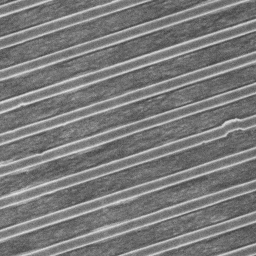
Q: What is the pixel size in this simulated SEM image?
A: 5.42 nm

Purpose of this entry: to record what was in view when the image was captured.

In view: parallel lines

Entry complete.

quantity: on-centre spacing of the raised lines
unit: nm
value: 165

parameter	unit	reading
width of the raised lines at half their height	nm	54.2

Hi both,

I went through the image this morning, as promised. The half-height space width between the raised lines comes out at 109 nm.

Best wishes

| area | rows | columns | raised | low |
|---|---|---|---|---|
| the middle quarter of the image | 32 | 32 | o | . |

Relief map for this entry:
............oooooooo............
.........oooooooo...............
......oooooooo.................o
..ooooooooo................ooooo
oooooooo................oooooooo
ooooo................oooooooo...
oo................oooooooo......
...............oooooooo.........
............oooooooo............
.........oooooooo...............
......oooooooo................oo
...oooooooo................ooooo
oooooooo................oooooooo
ooooo................oooooooo...
oo................oooooooo......
...............oooooooo.........
............oooooooo............
.........oooooooo...............
......oooooooo................oo
...oooooooo................ooooo
oooooooo.................ooooooo
oooo.................ooooooooo..
o.................oooooooo......
...............oooooooo.........
............oooooooo............
.........oooooooo...............
......oooooooo................oo
...oooooooo................ooooo
oooooooo................oooooooo
ooooo................oooooooo...
oo................oooooooo......
...............oooooooo.........